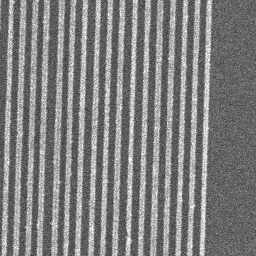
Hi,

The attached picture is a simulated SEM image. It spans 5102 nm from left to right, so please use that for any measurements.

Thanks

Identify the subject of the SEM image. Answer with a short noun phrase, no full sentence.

parallel lines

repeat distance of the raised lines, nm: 246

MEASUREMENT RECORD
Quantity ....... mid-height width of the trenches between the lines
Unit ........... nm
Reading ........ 149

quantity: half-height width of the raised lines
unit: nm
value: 94.6